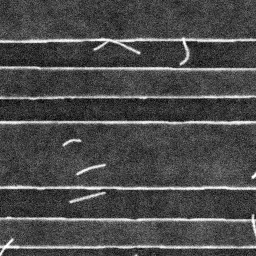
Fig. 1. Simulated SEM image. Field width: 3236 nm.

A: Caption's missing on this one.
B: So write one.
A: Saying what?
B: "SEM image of lines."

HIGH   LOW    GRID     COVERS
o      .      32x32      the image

oooooooooooooooooooooooooooooooo
oooooooooooooooooooooooooooooooo
oooooooooooooooooooooooooooooooo
oooooooooooooooooooooooooooooooo
oooooooooooooooooooooooooooooooo
................................
................................
................................
ooooo...........................
oooooooooooooooooooooooooooooooo
oooooooooooooooooooooooooooooooo
oooooooooooooooooooooooooooooooo
................................
................................
................................
oooooooooooooooooooooooooooooooo
oooooooooooooooooooooooooooooooo
oooooooooooooooooooooooooooooooo
oooooooooooooooooooooooooooooooo
oooooooooooooooooooooooooooooooo
oooooooooooooooooooooooooooooooo
oooooooooooooooooooooooooooooooo
oooooooooooooooooooooooooooooooo
oooooooooooooooooooooooooooooooo
................................
................................
................................
ooooooooooooooooooooooo.oooo...o
oooooooooooooooooooooooooooooooo
oooooooooooooooooooooooooooooooo
oooooooooooooooooooooooooooooooo
................................